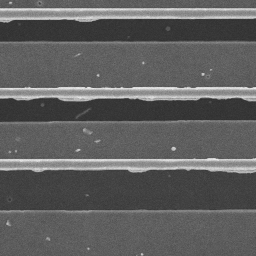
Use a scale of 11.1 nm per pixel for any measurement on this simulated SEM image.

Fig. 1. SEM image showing lines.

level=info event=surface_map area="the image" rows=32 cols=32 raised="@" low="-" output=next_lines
@@@@@@@@@@@@@@@@@@@@@@@@@@@@@@@@
@@@@@@@@@@@@@@@@@@@@@@@@@@@@@@@@
@@-------@@@--------------------
--------------------------------
--------------------------------
@@@@@@@@@@@@@@@@@@@@@@@@@@@@@@@@
@@@@@@@@@@@@@@@@@@@@@@@@@@@@@@@@
@@@@@@@@@@@@@@@@@@@@@@@@@@@@@@@@
@@@@@@@@@@@@@@@@@@@@@@@@@@@@@@@@
@@@@@@@@@@@@@@@@@@@@@@@@@@@@@@@@
@@@@@@@@@@@@@@@@@@@@@@@@@@@@@@@@
@@@@@@@@@@@@@@@@@@@@@@@@@@@@@@@@
--------@@@-------@@-----------@
--------------------------------
--------------------------------
@@@@@@@@@@@@@@@@@@@@@@@@@@@@@@@@
@@@@@@@@@@@@@@@@@@@@@@@@@@@@@@@@
@@@@@@@@@@@@@@@@@@@@@@@@@@@@@@@@
@@@@@@@@@@@@@@@@@@@@@@@@@@@@@@@@
@@@@@@@@@@@@@@@@@@@@@@@@@@@@@@@@
@@@@@@@@@@@@@@@@@@@@@@@@@@@@@@@@
-----------------------------@@@
--------------------------------
--------------------------------
--------------------------------
--------------------------------
@@@@@@@@@@@@@@@@@@@@@@@@@@@@@@@@
@@@@@@@@@@@@@@@@@@@@@@@@@@@@@@@@
@@@@@@@@@@@@@@@@@@@@@@@@@@@@@@@@
@@@@@@@@@@@@@@@@@@@@@@@@@@@@@@@@
@@@@@@@@@@@@@@@@@@@@@@@@@@@@@@@@
@@@@@@@@@@@@@@@@@@@@@@@@@@@@@@@@